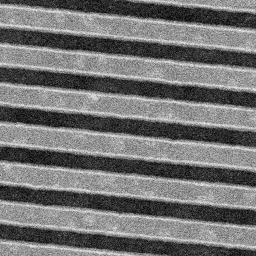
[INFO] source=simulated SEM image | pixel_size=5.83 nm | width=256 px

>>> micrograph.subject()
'parallel lines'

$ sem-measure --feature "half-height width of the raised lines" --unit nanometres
122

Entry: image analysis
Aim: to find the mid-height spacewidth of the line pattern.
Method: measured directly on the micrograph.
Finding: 106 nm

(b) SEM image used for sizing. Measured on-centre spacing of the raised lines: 228 nanometers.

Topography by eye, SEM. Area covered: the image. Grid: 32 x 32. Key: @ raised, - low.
----------------------@@@@@@@@@@
@@@@@@@@@-----------------------
@@@@@@@@@@@@@@@@@@@-------------
---@@@@@@@@@@@@@@@@@@@@@@@@@@---
-------------@@@@@@@@@@@@@@@@@@@
-----------------------@@@@@@@@@
@@@@@@@@@@----------------------
@@@@@@@@@@@@@@@@@@@-------------
---@@@@@@@@@@@@@@@@@@@@@@@@@@---
--------------@@@@@@@@@@@@@@@@@@
@----------------------@@@@@@@@@
@@@@@@@@@@----------------------
@@@@@@@@@@@@@@@@@@@@------------
-----@@@@@@@@@@@@@@@@@@@@@@@@@--
--------------@@@@@@@@@@@@@@@@@@
@-@----------------------@@@@@@@
@@@@@@@@@@@---------------------
@@@@@@@@@@@@@@@@@@@@@-----------
-----@@@@@@@@@@@@@@@@@@@@@@@@@@-
--------------@@@@@@@@@@@@@@@@@@
@@----------------------@@@@@@@@
@@@@@@@@@@@@--------------------
@@@@@@@@@@@@@@@@@@@@@@----------
----@@@@@@@@@@@@@@@@@@@@@@@@@@@-
----------------@@@@@@@@@@@@@@@@
@@@-----------------------@@@@@@
@@@@@@@@@@@@--------------------
@@@@@@@@@@@@@@@@@@@@@@----------
-------@@@@@@@@@@@@@@@@@@@@@@@@@
----------------@@@@@@@@@@@@@@@@
@@@------------------------@@@@@
@@@@@@@@@@@@@@------------------